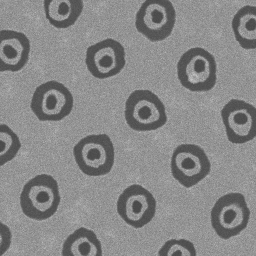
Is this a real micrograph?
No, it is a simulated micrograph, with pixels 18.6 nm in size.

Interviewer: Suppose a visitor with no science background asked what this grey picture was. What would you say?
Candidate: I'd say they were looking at a regular array of ring-shaped grooves with a dot in the middle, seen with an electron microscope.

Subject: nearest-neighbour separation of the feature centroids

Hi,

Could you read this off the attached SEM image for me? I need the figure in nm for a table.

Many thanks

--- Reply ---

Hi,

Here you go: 1210